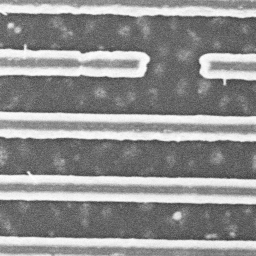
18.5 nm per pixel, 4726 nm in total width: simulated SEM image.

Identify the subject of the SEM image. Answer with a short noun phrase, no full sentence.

one or a few lines or trenches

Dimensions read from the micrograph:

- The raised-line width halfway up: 328 nm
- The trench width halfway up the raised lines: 0.815 micrometres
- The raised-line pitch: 1150 nm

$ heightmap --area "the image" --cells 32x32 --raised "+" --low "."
++++++++++++++++++++++++++++++++
................++...+...+++++++
................................
................................
................................
................................
................................
++++++++++++++++++........++++++
++++++++++++++++++........++++++
............................+.++
................................
................................
................................
................................
+...............................
++++++++++++++++++++++++++++++++
++++++++++++++++++++++++++++++++
................................
................................
................................
................................
................................
+++++++++...+++.................
++++++++++++++++++++++++++++++++
++.+++++++++++++++++++++++++++++
................................
................................
................................
................................
................................
+++++++++++++++++++++++++...++..
++++++++++++++++++++++++++++++++